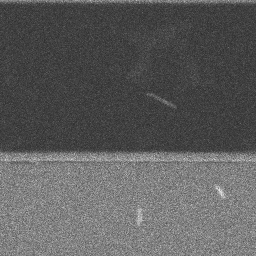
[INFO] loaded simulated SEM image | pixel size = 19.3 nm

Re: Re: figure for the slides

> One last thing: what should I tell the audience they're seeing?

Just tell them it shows one or a few lines or trenches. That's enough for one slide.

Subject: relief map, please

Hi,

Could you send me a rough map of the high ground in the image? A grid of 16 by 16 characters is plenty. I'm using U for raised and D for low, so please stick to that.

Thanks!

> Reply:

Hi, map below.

UUUUUUUUUUUUUUUU
UUUUUUUUUUUUUUUU
UUUUUUUUUUUUUUUU
UUUUUUUUUUUUUUUU
UUUUUUUUUUUUUUUU
UUUUUUUUUUUUUUUU
UUUUUUUUUUUUUUUU
UUUUUUUUUUUUUUUU
UUUUUUUUUUUUUUUU
UUUUUUUUUUUUUUUU
DDDDDDDDDDDDDDDD
DDDDDDDDDDDDDDDD
DDDDDDDDDDDDDDDD
DDDDDDDDDDDDDDDD
DDDDDDDDDDDDDDDD
DDDDDDDDDDDDDDDD